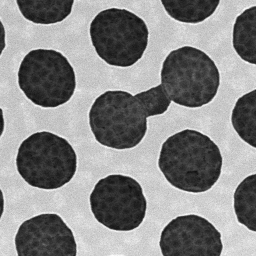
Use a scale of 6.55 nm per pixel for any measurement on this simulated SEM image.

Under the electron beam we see holes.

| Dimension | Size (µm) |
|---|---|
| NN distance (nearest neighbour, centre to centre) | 0.545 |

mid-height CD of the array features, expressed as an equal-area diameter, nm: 383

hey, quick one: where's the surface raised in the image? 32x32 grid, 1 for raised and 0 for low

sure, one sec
11000000011111111111000000011111
11100000011110001111100000011100
11110000111100000011110001111000
01111111111000000011111111111000
01111111111000000001111111111000
01111111111100000011111111111000
11110001111100000011100001111100
11100000111110000111100000111100
11000000011111111111000000011111
11000000011111111111000000011111
11000000011111111111000000011111
11100000011110001100000000011110
11110000011100000000000000111100
11111111111000000000011111111000
11111111111000000001111111111000
11111111111000000011111111111000
11111011111100000011110001111100
11100000111100000011100000111100
11000000011111001111000000011111
11000000001111111111000000001111
11000000001111111111000000001111
11000000011111111111000000001111
11100000011110000111100000011100
11111001111100000011110000111100
11111111111000000011111111111000
01111111111000000011111111111000
11111111111100000011111111111000
11100000111100000011110000111100
11000000011111000111100000011110
11000000011111111111000000001111
11000000011111111111000000001111
11000000001111111111000000001111